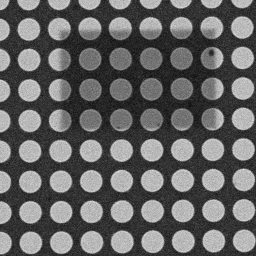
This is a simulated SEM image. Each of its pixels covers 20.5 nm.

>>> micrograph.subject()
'an array of small figures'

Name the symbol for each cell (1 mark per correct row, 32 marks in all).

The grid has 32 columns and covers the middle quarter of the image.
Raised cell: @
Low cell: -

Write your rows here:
@---@@@@@---@@@@----@@@@---@@@@-
------@-------------------------
--------------------------------
--------------------------------
@----@@@----@@@@----@@@@---@@@@-
@---@@@@@---@@@@@--@@@@@---@@@@@
@@--@@@@@---@@@@@--@@@@@@--@@@@@
@@--@@@@@---@@@@@--@@@@@---@@@@@
@----@@@-----@@@----@@@-----@@@-
--------------------------------
--------------------------------
------@@-----@@------@@-----@@@-
@----@@@@---@@@@@---@@@@---@@@@@
@@--@@@@@---@@@@@--@@@@@@--@@@@@
@@--@@@@@---@@@@@--@@@@@@--@@@@@
@---@@@@@---@@@@@---@@@@---@@@@@
------@@-----@@------@@------@--
--------------------------------
--------------------------------
@----@@@-----@@@----@@@@----@@@-
@@--@@@@@---@@@@@---@@@@@--@@@@@
@@--@@@@@---@@@@@--@@@@@@--@@@@@
@@--@@@@@---@@@@@--@@@@@@--@@@@@
@----@@@@---@@@@----@@@@----@@@-
--------------------------------
--------------------------------
-----------------------------@--
@----@@@@---@@@@@---@@@@----@@@@
@@--@@@@@---@@@@@--@@@@@@--@@@@@
@@--@@@@@---@@@@@--@@@@@@--@@@@@
@@--@@@@@---@@@@@---@@@@---@@@@@
@----@@@-----@@@-----@@-----@@@-